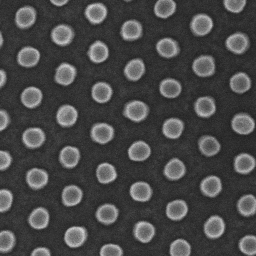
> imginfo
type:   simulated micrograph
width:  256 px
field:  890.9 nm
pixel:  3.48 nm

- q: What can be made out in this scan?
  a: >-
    a regular array of raised bodies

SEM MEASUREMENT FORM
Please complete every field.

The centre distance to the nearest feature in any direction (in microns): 0.137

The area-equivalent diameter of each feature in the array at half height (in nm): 70.8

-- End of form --